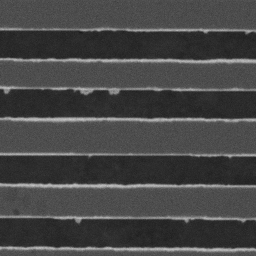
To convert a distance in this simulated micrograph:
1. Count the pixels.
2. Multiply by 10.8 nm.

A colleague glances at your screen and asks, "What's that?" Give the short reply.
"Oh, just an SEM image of lines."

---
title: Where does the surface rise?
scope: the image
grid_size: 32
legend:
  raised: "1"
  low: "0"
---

11111111111111111111111111111111
11111111111111111111111111111111
11111111111111111111111111111111
11111111111111111111111111111111
00000000000000000000000000000000
00000000000000000000000000000000
00000000000000000000000000000000
11111111111110001100110000000000
11111111111111111111111111111111
11111111111111111111111111111111
11111111111111111111111111111111
00000000000000000000000000000000
00000000000000000000000000000000
00000000000000000000000000000000
00000000000000000000000000000000
11111111111111111111111111111111
11111111111111111111111111111111
11111111111111111111111111111111
11111111111111111111111111111111
00000000000000000000000000000000
00000000000000000000000000000000
00000000000000000000000000000000
00000000000000000000000000000000
11111111111111111111111111111111
11111111111111111111111111111111
11111111111111111111111111111111
11111111111111111111111111111111
00000000000000000000000000000000
00000000000000000000000000000000
00000000000000000000000000000000
00000000000000000000000000000000
11111111111111111111111111111111